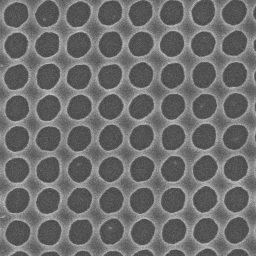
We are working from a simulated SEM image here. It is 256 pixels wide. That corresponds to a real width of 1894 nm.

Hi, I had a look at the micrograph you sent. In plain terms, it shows a regular array of holes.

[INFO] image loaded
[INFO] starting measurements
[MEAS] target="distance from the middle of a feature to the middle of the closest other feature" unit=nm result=228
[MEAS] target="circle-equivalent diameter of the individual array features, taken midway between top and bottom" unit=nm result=186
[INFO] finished